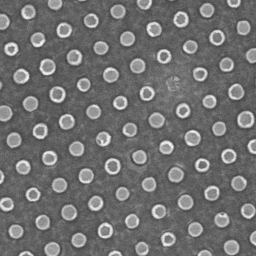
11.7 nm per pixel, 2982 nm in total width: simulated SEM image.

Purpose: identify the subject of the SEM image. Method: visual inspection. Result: a regular array of raised bodies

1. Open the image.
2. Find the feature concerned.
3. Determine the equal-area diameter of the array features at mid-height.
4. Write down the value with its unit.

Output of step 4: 163 nanometres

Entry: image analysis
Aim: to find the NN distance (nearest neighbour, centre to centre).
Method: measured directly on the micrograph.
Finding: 327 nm